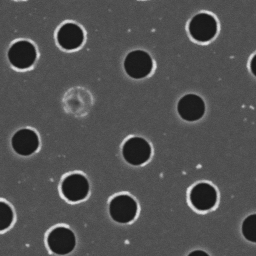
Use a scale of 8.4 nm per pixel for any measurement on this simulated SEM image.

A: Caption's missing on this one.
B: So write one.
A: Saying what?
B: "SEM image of a regular array of holes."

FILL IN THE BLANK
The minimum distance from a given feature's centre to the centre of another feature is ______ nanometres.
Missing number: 498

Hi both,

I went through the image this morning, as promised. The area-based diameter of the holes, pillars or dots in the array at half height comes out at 232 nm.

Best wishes